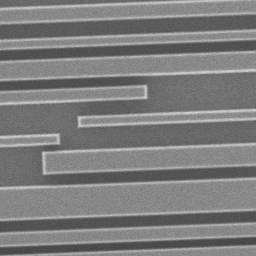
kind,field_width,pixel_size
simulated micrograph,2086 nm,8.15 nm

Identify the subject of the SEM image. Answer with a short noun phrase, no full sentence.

groups of lines, slits or small figures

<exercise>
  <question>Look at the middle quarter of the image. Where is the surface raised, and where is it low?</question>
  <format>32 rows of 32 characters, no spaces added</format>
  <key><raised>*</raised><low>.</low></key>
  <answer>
********************************
********************************
*************************.......
***.............................
................................
...................*............
********************............
*********************...........
*******************.............
................................
................................
................................
.........................*******
....****************************
....****************************
................................
................................
................................
................................
................................
................................
............********************
********************************
********************************
********************************
********************************
******************..............
................................
................................
.......................*********
.*******************************
********************************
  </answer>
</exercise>